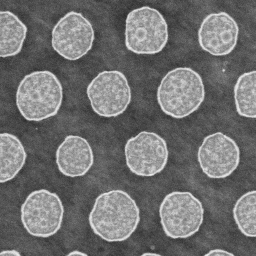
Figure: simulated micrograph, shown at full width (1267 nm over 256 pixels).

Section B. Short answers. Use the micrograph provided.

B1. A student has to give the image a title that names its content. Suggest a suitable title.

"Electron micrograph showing a regular array of raised bodies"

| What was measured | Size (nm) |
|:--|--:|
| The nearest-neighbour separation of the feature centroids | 337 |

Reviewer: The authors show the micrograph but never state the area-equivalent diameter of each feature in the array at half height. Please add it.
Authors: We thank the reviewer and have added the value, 43.5 px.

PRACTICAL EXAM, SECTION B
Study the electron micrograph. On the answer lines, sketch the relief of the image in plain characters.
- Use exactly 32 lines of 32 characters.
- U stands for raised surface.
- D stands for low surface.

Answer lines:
DDDDDDDDDDDDDDDDDDDDDDDDDDDDDDDD
UDDDDDDDDDDDDDDDUUUUDDDDDDDDDDDD
UUDDDDDDUUUDDDDDUUUUDDDDDDUUUDDD
UUUDDDDUUUUDDDDDUUUUUDDDDUUUUUDD
UUUDDDDUUUUUDDDDUUUUUDDDDUUUUUDD
UUUDDDDUUUUDDDDDUUUUUDDDDUUUUDDD
UUDDDDDUUUUDDDDDDUUDDDDDDDUUUDDD
DDDDDDDDDDDDDDDDDDDDDDDDDDDDDDDD
DDDDDDDDDDDDDDDDDDDDDDDDDDDDDDDD
DDDDUUUDDDDDUUUDDDDDDUUUUDDDDDUU
DDDUUUUDDDDUUUUUDDDDUUUUUDDDDDUU
DDUUUUUUDDDUUUUUDDDDUUUUUDDDDUUU
DDUUUUUUDDDUUUUUDDDDUUUUUDDDDUUU
DDUUUUUDDDDDUUUUDDDDUUUUDDDDDDUU
DDDUUUDDDDDDDDDDDDDDDDUDDDDDDDDU
DDDDDDDDDDDDDDDDDDDDDDDDDDDDDDDD
DDDDDDDDDDDDDDDDDDDDDDDDDDDDDDDD
UUDDDDDDUUUDDDDDUUUUDDDDDDUUUDDD
UUUDDDDUUUUDDDDDUUUUUDDDDUUUUUDD
UUUDDDDUUUUUDDDDUUUUUDDDDUUUUUDD
UUUDDDDUUUUDDDDDUUUUUDDDDUUUUUDD
UUDDDDDDUUUDDDDDDUUUDDDDDDUUUDDD
UDDDDDDDDDDDDDDDDDDDDDDDDDDDDDDD
DDDDDDDDDDDDDDDDDDDDDDDDDDDDDDDD
DDDDUUUDDDDDDUUUDDDDDUUUDDDDDDUU
DDDUUUUUDDDDUUUUUDDDUUUUUDDDDDUU
DDDUUUUUDDDUUUUUUDDDUUUUUDDDDUUU
DDDUUUUUDDDUUUUUUDDDUUUUUDDDDUUU
DDDUUUUDDDDDUUUUUDDDDUUUUDDDDDUU
DDDDDDDDDDDDDUUUDDDDDUUUDDDDDDDU
DDDDDDDDDDDDDDDDDDDDDDDDDDDDDDDD
UUDDDDDDDUDDDDDDDDDDDDDDDDUUDDDD